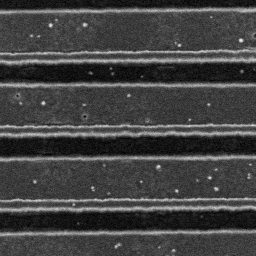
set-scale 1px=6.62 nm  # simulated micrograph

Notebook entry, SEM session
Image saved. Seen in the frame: lines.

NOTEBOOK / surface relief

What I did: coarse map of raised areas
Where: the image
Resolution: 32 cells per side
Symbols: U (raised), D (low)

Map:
DDDDDDDDDDDDDDDDDDDDDDDDDDDDDDDD
DDDDDDUUUUUUUUUUUUUUUUUUUUUUUUUU
UUUUUUUUUUUUUUUUUUUUUUUUUUUUUUUU
UUUUUUUUUUUUUUUUUUUUUUUUUUUUUUUU
UUUUUUUUUUUUUUUUUUUUUUUUUUUUUUUU
UUUUUUUUUUUUUUUUUUUUUUUUUUUUUUUU
UUUUUUUUUUUUUUUUUUUUUUUUUUUUUUUU
UUUUUUUUUUUUUUUUUUUUUUUUUUUUUUUU
DDDDDDDDDDDDDDDDDDDDDDDDDDDDDDDD
DDDDDDDDDDDDDDDDDDDDDDDDDDDDDDDD
DDDDDDDDDDDDDDDDDDDDDDDDDDDDDDDD
UUUUUUUUUUUUUUUUUUUUUUUUUUUUUUUU
UUUUUUUUUUUUUUUUUUUUUUUUUUUUUUUU
UUUUUUUUUUUUUUUUUUUUUUUUUUUUUUUU
UUUUUUUUUUUUUUUUUUUUUUUUUUUUUUUU
UUUUUUUUUUUUUUUUUUUUUUUUUUUUUUUU
UUUUUUUUUUUUUUUUUUUUUUUUUUUUUUUU
DDDDDDDDDDDDDDDDDDDDDDDDDDDDDDDD
DDDDDDDDDDDDDDDDDDDDDDDDDDDDDDDD
DDDDDDDDDDDDDDDDDDDDDDDDDDDDDDDD
UUUUUUUUUUUUUUUUUUUUUUUUUUUUUUUU
UUUUUUUUUUUUUUUUUUUUUUUUUUUUUUUU
UUUUUUUUUUUUUUUUUUUUUUUUUUUUUUUU
UUUUUUUUUUUUUUUUUUUUUUUUUUUUUUUU
UUUUUUUUUUUUUUUUUUUUUUUUUUUUUUUU
UUUUUUUUUUUUUUUUUUUUUUUUUUUUUUUU
DDDDDDDDDDDDDDDDDDDDDDDDDDDDDDDD
DDDDDDDDDDDDDDDDDDDDDDDDDDDDDDDD
DDDDDDDDDDDDDDDDDDDDDDDDDDDDDDDD
UUUUUUUUUUUUUUUUUUUUUUUUUUUUUUUU
UUUUUUUUUUUUUUUUUUUUUUUUUUUUUUUU
UUUUUUUUUUUUUUUUUUUUUUUUUUUUUUUU